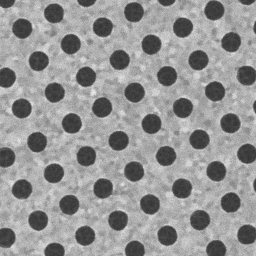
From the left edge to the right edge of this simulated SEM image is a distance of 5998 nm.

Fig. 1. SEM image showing a regular array of holes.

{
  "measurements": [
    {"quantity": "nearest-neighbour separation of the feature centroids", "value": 819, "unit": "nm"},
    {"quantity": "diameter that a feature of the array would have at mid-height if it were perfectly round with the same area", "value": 20.8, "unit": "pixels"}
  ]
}